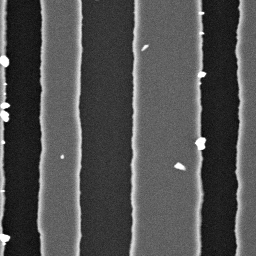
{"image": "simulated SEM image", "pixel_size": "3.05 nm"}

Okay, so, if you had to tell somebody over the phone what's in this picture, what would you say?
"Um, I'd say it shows lines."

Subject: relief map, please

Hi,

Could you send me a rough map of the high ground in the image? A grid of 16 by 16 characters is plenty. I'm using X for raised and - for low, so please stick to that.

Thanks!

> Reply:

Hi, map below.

---XX---XXXXX--X
---XX---XXXXX--X
---XX---XXXXX--X
---XX---XXXXX--X
---XX---XXXXX--X
---XX---XXXXX--X
---XX---XXXXX--X
---XX---XXXXX--X
---XX---XXXXX--X
---XX---XXXXX--X
---XX---XXXXX--X
---XX---XXXXX--X
--XXX---XXXXX--X
--XXX---XXXX---X
--XXX---XXXX---X
---XX---XXXX---X